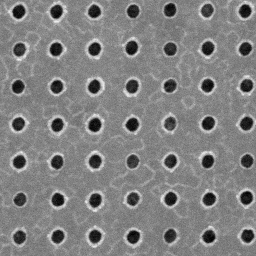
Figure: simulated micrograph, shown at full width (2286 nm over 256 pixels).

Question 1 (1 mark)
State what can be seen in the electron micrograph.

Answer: a regular array of holes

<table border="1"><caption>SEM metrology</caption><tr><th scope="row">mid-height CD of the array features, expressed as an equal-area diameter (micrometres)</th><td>0.126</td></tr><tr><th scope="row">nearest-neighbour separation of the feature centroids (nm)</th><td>331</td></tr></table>